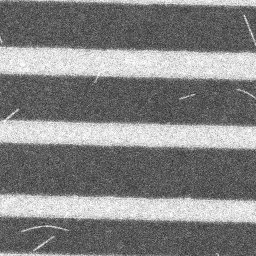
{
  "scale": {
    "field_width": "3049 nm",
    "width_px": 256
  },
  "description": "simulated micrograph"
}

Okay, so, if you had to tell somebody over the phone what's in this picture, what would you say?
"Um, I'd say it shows one or a few lines or trenches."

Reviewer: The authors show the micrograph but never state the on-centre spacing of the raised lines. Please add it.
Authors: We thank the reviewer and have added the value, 848 nm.